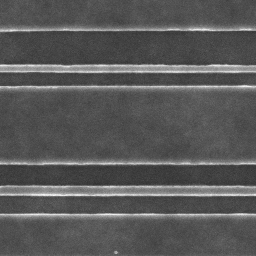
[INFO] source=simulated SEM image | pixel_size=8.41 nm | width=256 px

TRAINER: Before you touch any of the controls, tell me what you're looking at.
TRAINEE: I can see lines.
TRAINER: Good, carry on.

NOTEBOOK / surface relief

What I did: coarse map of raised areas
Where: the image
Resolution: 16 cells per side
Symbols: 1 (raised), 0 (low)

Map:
1111111111111111
1111111111111111
0000000000000000
0000000000000000
1111111111111111
1111111111111111
1111111111111111
1111111111111111
1111111111111111
1111111111111111
0000000000000000
0000000000000000
1111111111111111
1111111111111111
1111111111111111
1111111111111111